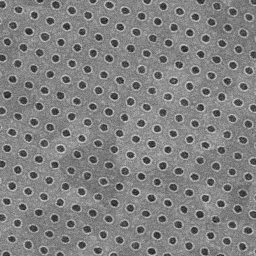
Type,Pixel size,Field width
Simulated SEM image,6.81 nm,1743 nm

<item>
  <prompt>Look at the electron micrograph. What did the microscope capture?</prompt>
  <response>a regular array of holes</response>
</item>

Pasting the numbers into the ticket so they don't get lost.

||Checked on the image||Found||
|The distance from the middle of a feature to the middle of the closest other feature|113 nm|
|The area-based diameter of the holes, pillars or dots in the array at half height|57.5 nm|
